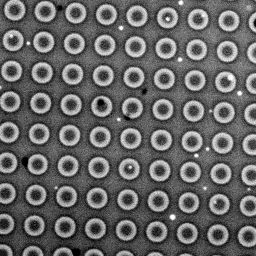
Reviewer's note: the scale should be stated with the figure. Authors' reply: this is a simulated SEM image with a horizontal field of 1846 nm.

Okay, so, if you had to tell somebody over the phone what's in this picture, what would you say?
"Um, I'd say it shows an array of small figures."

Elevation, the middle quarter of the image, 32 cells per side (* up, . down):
.***............................
****....****....***.....**......
*****..*****...*****...****....*
*****..*****...*****...****...**
****....****...*****...****...**
................***....****....*
................................
................................
****....***.....................
****...*****...****....***.....*
****...*****...****...*****...**
****...*****...****...*****...**
.**.....***....****....****...**
.......................***.....*
................................
.*..............................
***....****....***..............
****...****....****...****....**
****...*****..*****...*****...**
***....****...*****...*****...**
........**.....***....****....**
...............................*
................................
**......*.......................
***....****....***.....**.......
***...*****...*****...****....**
***...*****...*****...****...***
**.....****...*****...****...***
...............**.....****....**
................................
................................
***....***......................